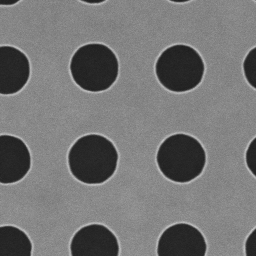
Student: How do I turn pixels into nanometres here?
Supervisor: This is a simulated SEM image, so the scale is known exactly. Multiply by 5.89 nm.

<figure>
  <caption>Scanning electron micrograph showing holes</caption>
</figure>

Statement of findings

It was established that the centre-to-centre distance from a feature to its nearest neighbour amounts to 511 nanometres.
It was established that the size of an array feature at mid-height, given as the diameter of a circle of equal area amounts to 283 nanometers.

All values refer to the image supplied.